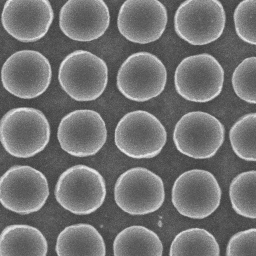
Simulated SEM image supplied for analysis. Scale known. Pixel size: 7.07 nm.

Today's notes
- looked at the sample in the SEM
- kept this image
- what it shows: a regular array of raised bodies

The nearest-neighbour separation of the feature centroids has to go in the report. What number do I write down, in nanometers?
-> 403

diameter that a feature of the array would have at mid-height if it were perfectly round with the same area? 339 nanometres